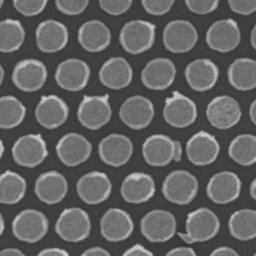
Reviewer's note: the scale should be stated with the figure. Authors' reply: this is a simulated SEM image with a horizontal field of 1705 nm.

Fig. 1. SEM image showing a regular array of raised bodies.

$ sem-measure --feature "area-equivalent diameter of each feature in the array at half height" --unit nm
212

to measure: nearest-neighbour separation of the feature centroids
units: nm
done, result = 283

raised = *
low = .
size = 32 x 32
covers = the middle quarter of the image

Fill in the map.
******....******.....******....*
******...********...********...*
******...********...********...*
******...********...*******....*
*****.....******....*******....*
*****......****......*****......
................................
...........................**...
.....******......**........****.
.....******....******....*******
*...*******...********....******
*...*******...********...*******
*...*******...********...*******
....*******...********...*******
.....*****.....******.....******
.....****.......****........**..
................................
................................
****......*****.......****......
******...*******....*******....*
******...********...*******....*
******...********...*******....*
******...********...*******....*
******...*******....*******....*
****......*****......*****......
................................
................................
.......***.......**........****.
.....******.....*****.....******
....*******....*******....******
*...********...*******...*******
....********..*********..*******